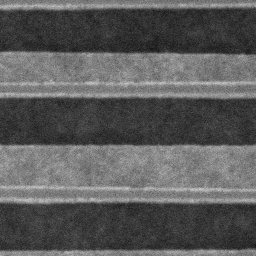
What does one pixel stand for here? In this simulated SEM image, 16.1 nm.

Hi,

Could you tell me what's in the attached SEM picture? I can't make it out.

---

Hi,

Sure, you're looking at lines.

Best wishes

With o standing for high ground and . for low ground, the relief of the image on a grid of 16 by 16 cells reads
................
................
................
oooooooooooooooo
oooooooooooooooo
oooooooooooooooo
................
................
................
oooooooooooooooo
oooooooooooooooo
oooooooooooooooo
..........oooooo
................
................
................